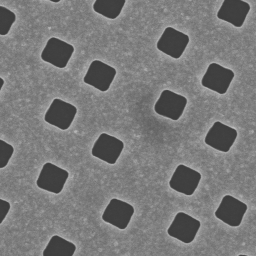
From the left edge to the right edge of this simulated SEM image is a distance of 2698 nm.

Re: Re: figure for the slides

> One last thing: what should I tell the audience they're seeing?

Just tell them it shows a regular array of holes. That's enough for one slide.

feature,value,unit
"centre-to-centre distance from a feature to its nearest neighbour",569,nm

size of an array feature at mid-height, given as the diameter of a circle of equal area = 306 nm